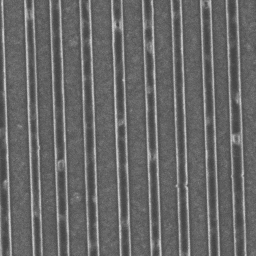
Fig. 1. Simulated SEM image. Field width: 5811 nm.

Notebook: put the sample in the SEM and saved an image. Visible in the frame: parallel lines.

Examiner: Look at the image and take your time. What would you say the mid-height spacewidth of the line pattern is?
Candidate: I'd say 442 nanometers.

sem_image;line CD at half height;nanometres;230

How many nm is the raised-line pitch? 656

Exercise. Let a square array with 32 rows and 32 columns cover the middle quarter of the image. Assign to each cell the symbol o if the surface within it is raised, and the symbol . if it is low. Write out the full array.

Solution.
.....oo......oo.....oo......oo..
.....oo......oo.....oo......oo..
.....oo......oo.....ooo.....oo..
.....oo......oo.....ooo.....oo..
.....oo......oo......oo.....oo..
.....oo......oo......oo.....oo..
.....oo......oo......oo.....oo..
.....oo......oo......oo.....oo..
.....oo......oo......oo.....oo..
.....oo......oo......oo.....oo..
.....oo......oo......oo.....oo..
.....oo......oo......oo.....oo..
.....oo......oo......oo.....oo..
.....oo......oo......oo.....oo..
.....oo......oo......oo.....oo..
.....oo......ooo.....oo.....oo..
.....ooo.....ooo.....oo.....oo..
.....ooo.....ooo.....oo.....oo..
.....ooo.....ooo.....oo.....oo..
.....ooo.....ooo.....oo.....oo..
.....ooo.....ooo.....oo.....oo..
.....ooo.....ooo.....oo.....oo..
.....ooo.....ooo.....oo.....oo..
.....ooo.....ooo.....oo.....oo..
.....ooo.....ooo.....oo.....oo..
......oo.....ooo.....oo.....oo..
......oo.....ooo.....oo.....ooo.
......oo.....ooo.....oo.....ooo.
o.....oo.....ooo.....oo.....ooo.
o.....oo......oo.....oo......oo.
o.....oo......oo.....oo.....oo..
o.....oo......oo.....ooo.....oo.